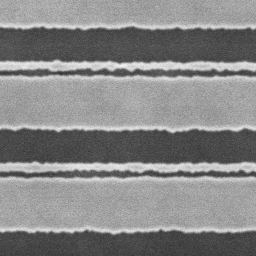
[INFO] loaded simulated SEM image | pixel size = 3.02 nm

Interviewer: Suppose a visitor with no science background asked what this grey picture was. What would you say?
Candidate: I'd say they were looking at lines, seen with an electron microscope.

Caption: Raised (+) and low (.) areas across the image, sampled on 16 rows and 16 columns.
++++++++++++++++
++++++++++++++++
................
................
++++++++++++++++
++++++++++++++++
++++++++++++++++
++++++++++++++++
................
................
++++++++++++++++
++++++++++++++++
++++++++++++++++
++++++++++++++++
.......+........
................